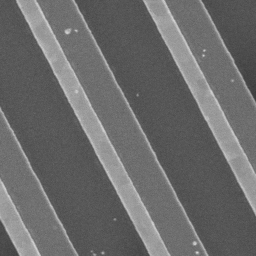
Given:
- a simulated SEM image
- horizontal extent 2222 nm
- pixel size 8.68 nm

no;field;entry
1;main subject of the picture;lines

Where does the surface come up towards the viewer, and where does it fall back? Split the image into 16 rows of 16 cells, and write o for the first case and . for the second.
.oooo....oooo...
..ooo.....ooo...
..oooo....oooo..
...ooo.....ooo..
...oooo....oooo.
....ooo.....ooo.
....oooo....oooo
.....oooo....ooo
o....oooo....ooo
o.....oooo....oo
oo.....ooo....oo
ooo....oooo....o
ooo.....ooo.....
oooo....oooo....
oooo.....ooo....
.oooo....oooo...